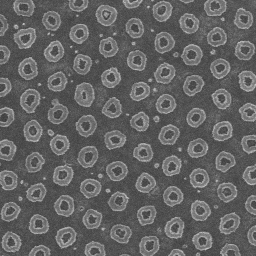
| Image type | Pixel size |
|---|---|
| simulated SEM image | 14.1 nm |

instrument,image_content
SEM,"a regular array of ring-shaped raised bodies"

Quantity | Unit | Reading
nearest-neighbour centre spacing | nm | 427